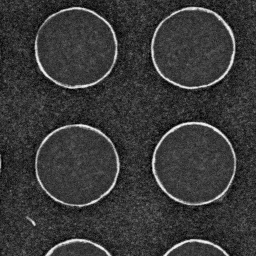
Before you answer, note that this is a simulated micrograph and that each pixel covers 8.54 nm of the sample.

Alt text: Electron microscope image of raised bodies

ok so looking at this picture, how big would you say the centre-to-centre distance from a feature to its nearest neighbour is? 993 nm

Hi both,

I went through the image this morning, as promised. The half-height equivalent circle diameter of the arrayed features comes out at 698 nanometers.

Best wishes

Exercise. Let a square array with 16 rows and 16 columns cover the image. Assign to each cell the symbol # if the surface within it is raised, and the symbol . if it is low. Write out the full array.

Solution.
................
...####...####..
..#####...#####.
..#####...#####.
...####...####..
................
................
................
...####...####..
..#####...#####.
..#####...#####.
...####...####..
....##.....##...
................
................
...###.....###..